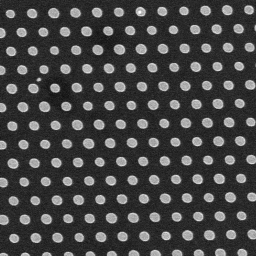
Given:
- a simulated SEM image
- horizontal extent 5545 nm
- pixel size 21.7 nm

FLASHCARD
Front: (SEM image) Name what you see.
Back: a regular array of raised bodies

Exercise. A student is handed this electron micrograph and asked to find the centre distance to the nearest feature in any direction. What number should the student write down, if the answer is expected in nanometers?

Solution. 464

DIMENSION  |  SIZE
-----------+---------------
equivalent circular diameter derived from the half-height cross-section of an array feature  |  197 nanometres